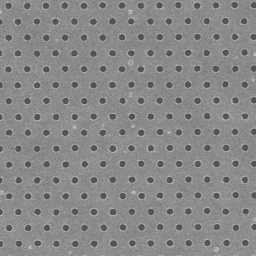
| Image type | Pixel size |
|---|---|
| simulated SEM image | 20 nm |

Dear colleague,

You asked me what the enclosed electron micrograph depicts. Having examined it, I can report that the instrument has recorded a regular array of holes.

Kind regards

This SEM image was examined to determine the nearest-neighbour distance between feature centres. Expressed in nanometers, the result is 363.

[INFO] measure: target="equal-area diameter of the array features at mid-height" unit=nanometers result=130